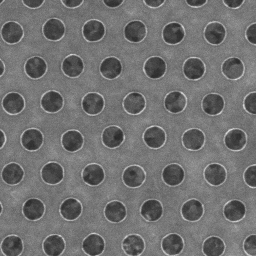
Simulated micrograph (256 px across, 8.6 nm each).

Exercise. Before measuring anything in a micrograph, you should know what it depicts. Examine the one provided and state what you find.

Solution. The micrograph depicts a regular array of raised bodies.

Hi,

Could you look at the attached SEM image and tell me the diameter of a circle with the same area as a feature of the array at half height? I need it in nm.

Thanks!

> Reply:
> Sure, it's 198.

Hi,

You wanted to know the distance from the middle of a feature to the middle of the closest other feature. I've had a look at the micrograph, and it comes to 333 nm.